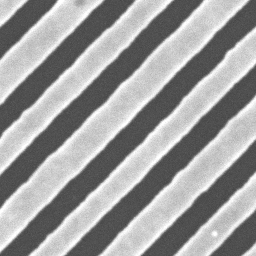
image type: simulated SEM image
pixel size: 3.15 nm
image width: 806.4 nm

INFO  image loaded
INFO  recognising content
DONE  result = lines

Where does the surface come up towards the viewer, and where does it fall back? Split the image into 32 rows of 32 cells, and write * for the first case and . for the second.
***....*****.....****....******.
**....*****.....****....******..
*....*****.....****....******...
....*****.....****....******....
...*****.....****....******....*
..*****.....****....******....**
.*****.....****....******....***
*****.....****....******....****
****.....****....******....****.
***.....****....******....****..
**.....****....******....****...
*.....****....******....****....
*....****....******....****.....
....****....******....****.....*
...****....******....****....***
..****....******....****....****
.****....******....****.....****
****....******....****.....*****
***....******....****.....*****.
**....******....****.....*****..
*....******....****.....*****...
....******....****....******....
....*****....*****....*****....*
..******....*****....*****....**
.******....****.....*****....***
.*****....****.....*****....****
*****....****.....*****....*****
****....****.....*****....*****.
***....****.....*****....****...
**....****.....*****....*****...
*....****.....*****....*****....
....****.....*****....*****....*